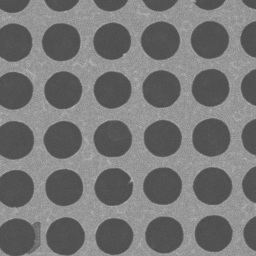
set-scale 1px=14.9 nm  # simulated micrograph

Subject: a regular array of holes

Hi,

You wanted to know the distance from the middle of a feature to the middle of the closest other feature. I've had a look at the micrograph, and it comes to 717 nanometers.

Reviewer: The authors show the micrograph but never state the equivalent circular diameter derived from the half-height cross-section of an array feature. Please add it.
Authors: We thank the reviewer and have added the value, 568 nm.